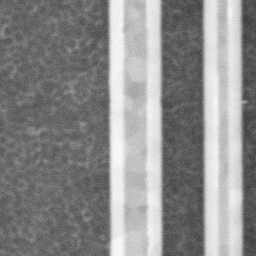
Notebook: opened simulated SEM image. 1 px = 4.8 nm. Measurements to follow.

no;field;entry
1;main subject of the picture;one or a few lines or trenches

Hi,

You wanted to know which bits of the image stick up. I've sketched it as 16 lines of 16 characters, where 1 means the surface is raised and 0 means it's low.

0000000111000110
0000000111000110
0000000111000110
0000000111000110
0000000111000110
0000000111000110
0000000111000110
0000000111000110
0000000111000110
0000000111000110
0000000111000110
0000000111000110
0000000111000110
0000000111000110
0000000111000110
0000000111000110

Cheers